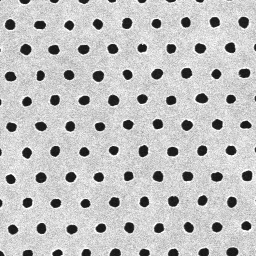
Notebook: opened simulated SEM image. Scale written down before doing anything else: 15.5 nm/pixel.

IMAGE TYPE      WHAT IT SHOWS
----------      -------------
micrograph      a regular array of holes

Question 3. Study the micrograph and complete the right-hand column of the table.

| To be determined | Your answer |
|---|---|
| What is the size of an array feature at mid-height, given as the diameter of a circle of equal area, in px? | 10.5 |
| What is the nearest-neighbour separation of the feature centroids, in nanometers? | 443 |